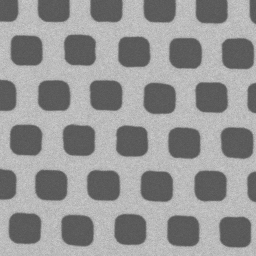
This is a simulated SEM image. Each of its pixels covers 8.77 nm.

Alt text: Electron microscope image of a regular array of holes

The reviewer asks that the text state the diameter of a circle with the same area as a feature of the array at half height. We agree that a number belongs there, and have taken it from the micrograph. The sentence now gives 34 px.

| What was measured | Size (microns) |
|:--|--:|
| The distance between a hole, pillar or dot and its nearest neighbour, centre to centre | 0.45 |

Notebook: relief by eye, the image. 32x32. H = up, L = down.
LLHHHLLLLHHLLLLHHHLLLLHHLLLLHHHL
LLHHHLLLLHHLLLLHHHLLLLHHLLLLHHHL
LLHHHLLLHHHHLLLHHHLLLLHHHLLLHHHL
HHHHHHHHHHHHHHHHHHHHHHHHHHHHHHHH
HHLLLHHHHLLHHHHHHHHHHHHHHHHHHHHH
HLLLLHHHLLLLHHHLLLLHHLLLLHHHLLLL
HLLLLHHHLLLLHHHLLLLHHLLLLHHHLLLL
HLLLLHHHLLLLHHHLLLLHHLLLLHHHLLLL
HHHHHHHHHHHHHHHHHHHHHHLLLHHHHLLH
HHHHHHHHHHHHHHHHHHHHHHHHHHHHHHHH
LLHHHLLLHHHLLLLHHHHLLHHHHLLLHHHH
LLHHHLLLLHHLLLLHHHLLLLHHLLLLHHHL
LLHHHLLLLHHLLLLHHHLLLLHHLLLLHHHL
LLHHHLLLHHHHLLLHHHLLLLHHHLLLHHHL
HHHHHHHHHHHHHHHHHHHHHHHHHHHHHHHH
HHHHHHHHHHHHHHHHHHHHHHHHHHHHHHHH
HLLLLHHHLLLLHHHLLLHHHLLLLHHHLLLH
HLLLLHHHLLLLHHLLLLLHHLLLLHHHLLLL
HLLLLHHHLLLLHHHLLLHHHLLLLHHHLLLL
HHHHHHHHHLLHHHHHLLHHHHLLLHHHLLLH
HHHHHHHHHHHHHHHHHHHHHHHHHHHHHHHH
LLHHHLLLHHHLLLHHHHLLLHHHHLLLHHHH
LLHHLLLLHHHLLLLHHHLLLLHHLLLLHHHL
LLHHLLLLHHHLLLLHHHLLLLHHLLLLHHHL
LLHHHLLLHHHLLLLHHHLLLLHHLLLLHHHL
HHHHHHHHHHHHHHHHHHHHHHHHHHHHHHHH
HHHHHHHHHHHHHHHHHHHHHHHHHHHHHHHH
HLLLLHHHLLLHHHLLLLHHHLLLLHHHLLLH
HLLLLHHHLLLLHHLLLLHHHLLLLHHLLLLH
HLLLLHHHLLLLHHLLLLHHHLLLLHHLLLLH
HHHLHHHHLLLHHHHLLHHHHLLLHHHHLLLH
HHHHHHHHHHHHHHHHHHHHHHHHHHHHHHHH